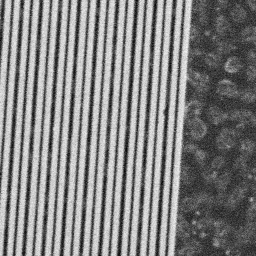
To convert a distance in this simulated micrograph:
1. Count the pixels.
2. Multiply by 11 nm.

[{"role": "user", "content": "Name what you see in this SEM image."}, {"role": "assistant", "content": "parallel lines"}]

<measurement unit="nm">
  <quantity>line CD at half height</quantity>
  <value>59.2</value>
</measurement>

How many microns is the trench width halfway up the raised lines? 0.0303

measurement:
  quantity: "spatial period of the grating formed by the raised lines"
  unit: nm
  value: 104